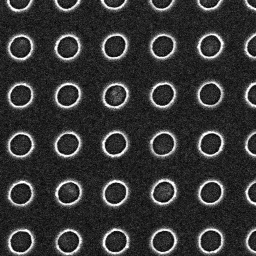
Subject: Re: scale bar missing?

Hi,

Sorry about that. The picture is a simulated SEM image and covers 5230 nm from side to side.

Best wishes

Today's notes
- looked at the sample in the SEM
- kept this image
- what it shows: a regular array of holes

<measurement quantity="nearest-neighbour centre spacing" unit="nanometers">964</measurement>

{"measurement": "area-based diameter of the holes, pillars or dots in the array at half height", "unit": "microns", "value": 0.449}